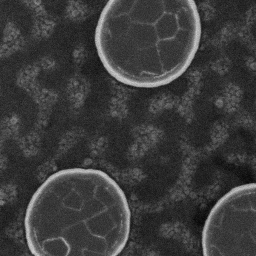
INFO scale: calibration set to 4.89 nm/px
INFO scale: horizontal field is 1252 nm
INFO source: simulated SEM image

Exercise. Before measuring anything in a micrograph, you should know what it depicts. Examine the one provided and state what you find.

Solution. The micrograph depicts raised bodies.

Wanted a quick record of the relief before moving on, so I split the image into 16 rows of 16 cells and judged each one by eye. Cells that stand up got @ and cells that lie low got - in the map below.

-------@@@@@----
------@@@@@@----
------@@@@@@----
------@@@@@@----
-------@@@@-----
----------------
----------------
----------------
----------------
----------------
----------------
---@@@@---------
--@@@@@@------@@
--@@@@@@-----@@@
--@@@@@@-----@@@
--@@@@@@-----@@@